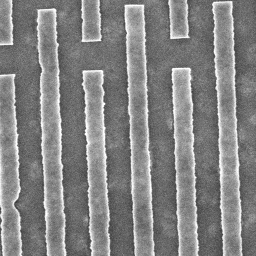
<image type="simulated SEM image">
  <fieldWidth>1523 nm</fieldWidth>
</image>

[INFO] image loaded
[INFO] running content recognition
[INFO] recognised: parallel lines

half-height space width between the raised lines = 0.153 micrometres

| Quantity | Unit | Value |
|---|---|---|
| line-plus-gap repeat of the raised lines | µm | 0.262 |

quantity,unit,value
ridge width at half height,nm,108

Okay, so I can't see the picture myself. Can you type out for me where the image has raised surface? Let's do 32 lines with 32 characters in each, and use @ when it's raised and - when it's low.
@---------@@---------@@----@@---
@----@@---@@----@@---@@----@@---
@----@@---@@@---@@---@@----@@---
@@---@@---@@@@@@@@---@@----@@---
@@---@@---@@@---@@---@@----@@---
@----@@---------@@---------@@---
-----@@---------@@---------@@---
-----@@---------@@---------@@---
-----@@---------@@---------@@---
@@---@@---@@@---@@----@@---@@---
@@---@@---@@@---@@----@@---@@---
@@---@@----@@---@@----@@---@@--@
@@---@@----@@---@@----@@---@@---
@@---@@----@@---@@----@@---@@---
@@---@@----@@---@@----@@---@@---
@@---@@@---@@---@@---@@@---@@@--
@@---@@@---@@---@@@---@@---@@@--
@@---@@@---@@---@@@---@@---@@@--
@@---@@@---@@---@@@---@@---@@@--
@@---@@@---@@---@@@---@@----@@--
@@---@@@---@@---@@@---@@---@@@--
@@--@@@@---@@---@@@---@@----@@--
@@----@@---@@----@@---@@----@@--
@@----@@---@@@--@@@---@@----@@--
@@----@@---@@---@@@---@@----@@--
@@----@@---@@----@@---@@----@@--
@@----@@---@@@---@@---@@@---@@--
@@----@@---@@@---@@---@@@---@@--
@@@---@@---@@@---@@---@@@---@@--
@@@---@@---@@@---@@---@@@---@@--
@@@---@@---@@@---@@---@@@---@@--
@@@---@@---@@@---@@---@@@---@@--